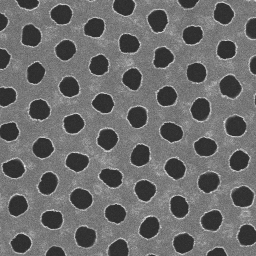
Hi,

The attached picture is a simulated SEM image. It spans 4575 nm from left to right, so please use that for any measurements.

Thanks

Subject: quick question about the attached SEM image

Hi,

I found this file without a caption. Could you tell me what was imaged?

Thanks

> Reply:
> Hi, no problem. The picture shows a regular array of holes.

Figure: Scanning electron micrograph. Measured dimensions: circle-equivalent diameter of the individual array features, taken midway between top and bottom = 0.357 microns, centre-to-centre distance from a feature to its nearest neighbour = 645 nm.